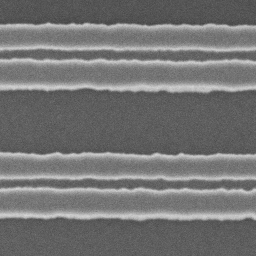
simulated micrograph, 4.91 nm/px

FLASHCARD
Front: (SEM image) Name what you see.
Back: lines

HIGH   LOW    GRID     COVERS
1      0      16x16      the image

0000000000000000
0000000000000000
1111111111111111
1111111111111111
1111111111111111
0001001111111111
0000000000000000
0000000000000000
0000000000000000
0000000000000000
1111111111111111
1111111111111111
1111111111111111
1111111111111111
0000000000000000
0000000000000000